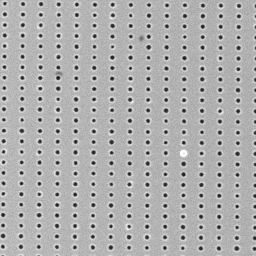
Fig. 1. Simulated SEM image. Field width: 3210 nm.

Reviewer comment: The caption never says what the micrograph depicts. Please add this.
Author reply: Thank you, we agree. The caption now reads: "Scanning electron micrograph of a regular array of holes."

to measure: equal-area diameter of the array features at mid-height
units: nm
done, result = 54.8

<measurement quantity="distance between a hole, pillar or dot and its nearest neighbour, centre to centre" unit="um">0.131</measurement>